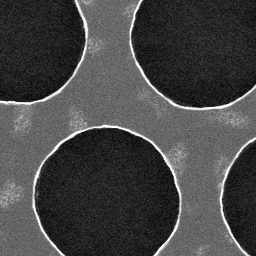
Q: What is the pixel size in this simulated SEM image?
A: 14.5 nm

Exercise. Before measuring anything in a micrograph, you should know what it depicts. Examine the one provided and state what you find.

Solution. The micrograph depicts holes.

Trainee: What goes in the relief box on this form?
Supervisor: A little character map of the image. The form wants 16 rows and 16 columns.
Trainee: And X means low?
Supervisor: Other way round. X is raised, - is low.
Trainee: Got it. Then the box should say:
-----XXXX-------
-----XXX--------
-----XXX--------
-----XXX--------
-----XXXX-------
----XXXXXX------
XXXXXXXXXXX---XX
XXXXXXXXXXXXXXXX
XXXXX----XXXXXXX
XXX-------XXXXX-
XXX--------XXX--
XX---------XXX--
XX---------XXX--
XX---------XXX--
XXX--------XXX--
XXXX------XXXXX-